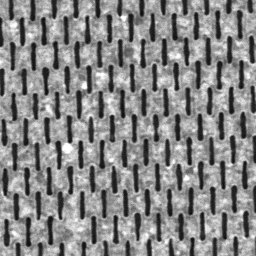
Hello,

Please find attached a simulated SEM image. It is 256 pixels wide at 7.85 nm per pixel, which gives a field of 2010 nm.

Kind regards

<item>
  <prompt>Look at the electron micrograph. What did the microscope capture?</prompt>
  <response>a regular array of holes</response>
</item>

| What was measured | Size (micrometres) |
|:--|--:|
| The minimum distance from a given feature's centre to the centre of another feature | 0.17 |